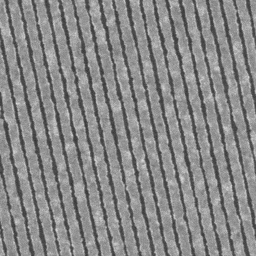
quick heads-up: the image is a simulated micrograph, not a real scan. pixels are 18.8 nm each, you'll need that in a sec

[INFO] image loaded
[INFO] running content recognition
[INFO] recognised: parallel lines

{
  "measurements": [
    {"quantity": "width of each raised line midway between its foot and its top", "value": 0.161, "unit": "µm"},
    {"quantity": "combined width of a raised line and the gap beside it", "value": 247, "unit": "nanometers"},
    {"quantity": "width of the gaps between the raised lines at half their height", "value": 4.53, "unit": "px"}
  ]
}